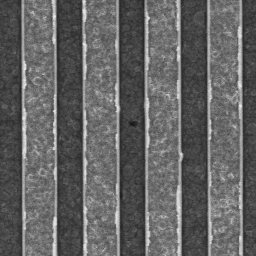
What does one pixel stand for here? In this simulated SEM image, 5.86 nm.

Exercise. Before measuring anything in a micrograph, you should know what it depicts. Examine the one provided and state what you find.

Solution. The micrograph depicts one or a few lines or trenches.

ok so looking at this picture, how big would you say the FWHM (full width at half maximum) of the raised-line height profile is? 34.2 px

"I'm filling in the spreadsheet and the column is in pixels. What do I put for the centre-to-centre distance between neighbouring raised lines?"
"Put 61.9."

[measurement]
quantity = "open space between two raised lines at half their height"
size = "158 nm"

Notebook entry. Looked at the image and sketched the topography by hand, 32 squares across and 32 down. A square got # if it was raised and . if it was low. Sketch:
...####...#####...####....####..
...####...#####...####....####..
...####...#####...####....####..
...####...#####...####....####..
...####...#####...####....####..
...####...#####...####....####..
...####...#####...####....####..
...####...#####...####....####..
...####...#####...####....####..
...####...#####...####....####..
...####...#####...####....####..
...####...#####...####....####..
...####...#####...####....####..
...####...#####...####....####..
...####...#####...####....####..
...####...#####...####....####..
...####...#####...####....####..
...####...#####...####....####..
...####...#####...####....####..
...####...#####...#####...####..
...####...#####...#####...####..
...####...#####...####....####..
...####...#####...####....####..
...####...#####...####....####..
...####...#####...#####...####..
...####...#####...#####...####..
...####...#####...#####...####..
...####...#####...#####...####..
...####...#####...#####...####..
...####...#####...#####...####..
...####...#####...#####...####..
...####...#####...#####...####..